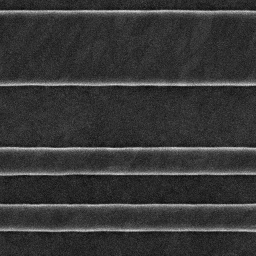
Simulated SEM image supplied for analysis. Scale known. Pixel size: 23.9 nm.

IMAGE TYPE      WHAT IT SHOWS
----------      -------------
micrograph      wiring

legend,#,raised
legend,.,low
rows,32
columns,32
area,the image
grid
................................
################################
################################
################################
################################
################################
################################
################################
################################
################################
################################
................................
................................
................................
................................
................................
................................
................................
#######.######.#################
################################
################################
################################
................................
................................
................................
................................
################################
################################
################################
................................
................................
................................